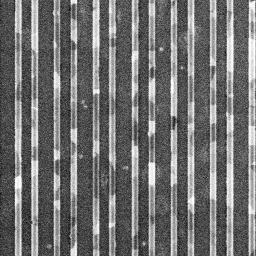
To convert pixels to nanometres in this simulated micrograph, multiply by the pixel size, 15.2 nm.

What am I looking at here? parallel lines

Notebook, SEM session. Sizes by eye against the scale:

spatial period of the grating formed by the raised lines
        0.298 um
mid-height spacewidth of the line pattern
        210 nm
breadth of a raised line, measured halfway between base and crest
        76.1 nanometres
